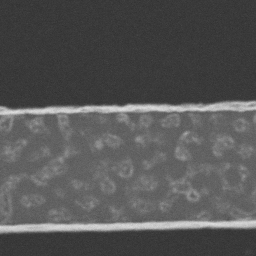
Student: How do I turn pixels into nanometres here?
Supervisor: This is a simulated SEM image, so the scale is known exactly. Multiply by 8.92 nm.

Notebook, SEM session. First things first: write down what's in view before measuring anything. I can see one or a few lines or trenches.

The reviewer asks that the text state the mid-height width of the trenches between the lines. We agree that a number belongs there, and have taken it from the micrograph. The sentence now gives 116 px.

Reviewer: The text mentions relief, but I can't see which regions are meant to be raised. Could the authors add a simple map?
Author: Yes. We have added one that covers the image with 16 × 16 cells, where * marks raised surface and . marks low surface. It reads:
****************
****************
****************
****************
****************
****************
****************
................
................
................
................
................
................
................
****************
****************